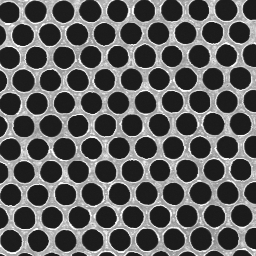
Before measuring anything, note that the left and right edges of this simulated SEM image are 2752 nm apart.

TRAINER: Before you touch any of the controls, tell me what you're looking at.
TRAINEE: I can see a regular array of holes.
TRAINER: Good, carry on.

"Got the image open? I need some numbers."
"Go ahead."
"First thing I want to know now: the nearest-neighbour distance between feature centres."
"0.283 micrometres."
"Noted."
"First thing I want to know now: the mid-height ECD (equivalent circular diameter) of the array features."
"0.23 microns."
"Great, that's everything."